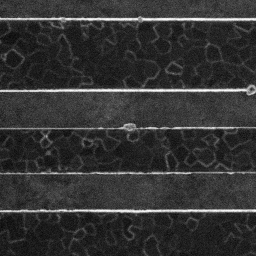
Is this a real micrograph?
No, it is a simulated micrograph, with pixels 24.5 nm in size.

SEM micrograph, lines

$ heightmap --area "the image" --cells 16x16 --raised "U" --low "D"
DDDDDDDDDDDDDDDD
UUUUUUUUUUUUUUUU
UUUUUUUUUUUUUUUU
UUUUUUUUUUUUUUUU
UUUUUUUUUUUUUUUU
UUUUUUUUUUUUUUUU
DDDDDDDDDDDDDDDD
DDDDDDDDDDDDDDDD
UUUUUUUUUUUUUUUU
UUUUUUUUUUUUUUUU
UUUUUUUUUUUUUUUU
DDDDDDDDDDDDDDDD
DDDDDDDDDDDDDDDD
UUUUUUUUUUUUUUUU
UUUUUUUUUUUUUUUU
UUUUUUUUUUUUUUUU